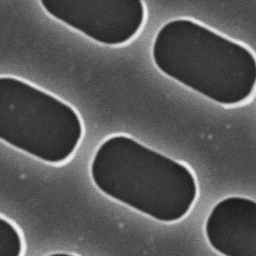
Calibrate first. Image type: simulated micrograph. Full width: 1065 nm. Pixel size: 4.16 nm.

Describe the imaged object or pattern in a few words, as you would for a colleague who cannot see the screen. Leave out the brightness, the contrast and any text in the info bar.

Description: holes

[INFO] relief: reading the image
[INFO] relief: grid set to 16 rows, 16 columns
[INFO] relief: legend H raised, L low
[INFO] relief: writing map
HHHLLLLLLHHHHHHH
HHHHLLLLLHLLHHHH
HHHHHHLLHHLLLLHH
HHHHHHHHHHLLLLLL
HHHHHHHHHHLLLLLL
LLHHHHHHHHHHLLLL
LLLLHHHHHHHHHHHH
LLLLLHHHHHHHHHHH
LLLLLHHHHHHHHHHH
HHLLHHLLLLHHHHHH
HHHHHHLLLLLLHHHH
HHHHHHLLLLLLHHHH
HHHHHHHLLLLLHHLL
HHHHHHHHHLLHHLLL
LHHHHHHHHHHHHLLL
LHHHHHHHHHHHHLLL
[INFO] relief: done